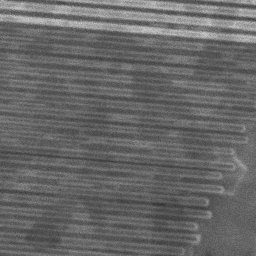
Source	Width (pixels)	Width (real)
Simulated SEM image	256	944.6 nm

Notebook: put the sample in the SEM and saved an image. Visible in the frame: parallel lines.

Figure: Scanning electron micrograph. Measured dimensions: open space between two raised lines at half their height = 0.0234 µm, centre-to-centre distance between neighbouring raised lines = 12.8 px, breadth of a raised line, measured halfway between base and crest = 23.4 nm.